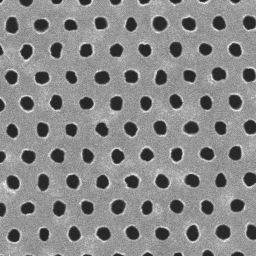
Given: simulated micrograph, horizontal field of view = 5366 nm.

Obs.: a regular array of holes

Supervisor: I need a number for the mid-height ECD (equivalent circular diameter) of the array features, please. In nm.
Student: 284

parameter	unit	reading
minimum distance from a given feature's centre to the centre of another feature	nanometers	608